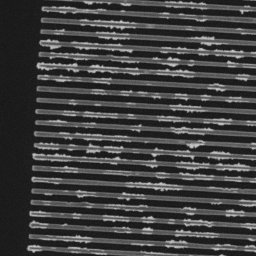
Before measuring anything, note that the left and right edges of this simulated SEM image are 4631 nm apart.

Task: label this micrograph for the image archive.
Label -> parallel lines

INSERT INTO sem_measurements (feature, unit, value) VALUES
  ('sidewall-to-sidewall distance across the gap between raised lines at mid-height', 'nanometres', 113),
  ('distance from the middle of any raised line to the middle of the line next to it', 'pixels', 11.4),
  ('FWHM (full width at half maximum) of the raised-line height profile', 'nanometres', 94.8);